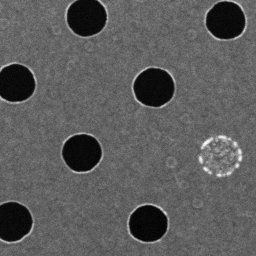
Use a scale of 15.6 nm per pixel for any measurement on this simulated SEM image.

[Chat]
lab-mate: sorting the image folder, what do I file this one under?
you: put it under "holes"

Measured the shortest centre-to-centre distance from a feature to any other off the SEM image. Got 1.51 micrometres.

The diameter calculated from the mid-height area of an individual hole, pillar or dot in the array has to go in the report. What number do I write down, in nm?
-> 608